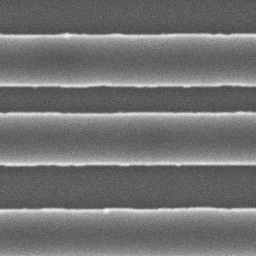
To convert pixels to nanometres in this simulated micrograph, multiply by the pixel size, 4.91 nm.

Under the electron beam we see lines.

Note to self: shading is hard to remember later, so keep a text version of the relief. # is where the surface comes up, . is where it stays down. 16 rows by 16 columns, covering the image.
................
................
################
################
################
................
................
################
################
################
................
................
................
################
################
################